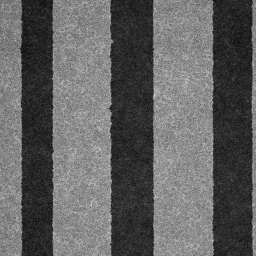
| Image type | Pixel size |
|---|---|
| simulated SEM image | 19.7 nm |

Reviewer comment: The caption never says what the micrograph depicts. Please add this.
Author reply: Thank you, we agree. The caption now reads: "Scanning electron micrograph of one or a few lines or trenches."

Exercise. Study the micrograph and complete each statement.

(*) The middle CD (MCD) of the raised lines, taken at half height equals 1150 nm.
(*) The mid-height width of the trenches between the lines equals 0.783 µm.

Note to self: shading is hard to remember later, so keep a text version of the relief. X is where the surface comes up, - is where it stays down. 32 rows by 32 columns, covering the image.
XXX----XXXXXXX-----XXXXXXXX-----
XXX----XXXXXXX-----XXXXXXXX-----
XXX----XXXXXXX-----XXXXXXX------
XXX----XXXXXXX-----XXXXXXXX-----
XXX----XXXXXXX-----XXXXXXXX-----
XXX----XXXXXXX-----XXXXXXXX-----
XXX----XXXXXXX-----XXXXXXXX-----
XXX----XXXXXXX-----XXXXXXXX-----
XXX----XXXXXXX-----XXXXXXXX-----
XXX----XXXXXXX-----XXXXXXX------
XXX----XXXXXXX-----XXXXXXXX-----
XXX----XXXXXXX-----XXXXXXXX-----
XXX----XXXXXXX-----XXXXXXXX-----
XXX----XXXXXXX-----XXXXXXXX-----
XXX----XXXXXXX-----XXXXXXXX-----
XXX----XXXXXXX-----XXXXXXXX-----
XXX----XXXXXXX-----XXXXXXXX-----
XXX----XXXXXXX-----XXXXXXXX-----
XXX----XXXXXXX-----XXXXXXXX-----
XXX----XXXXXXX-----XXXXXXXX-----
XXX----XXXXXXX-----XXXXXXXX-----
XXX----XXXXXXX-----XXXXXXXX-----
XXX----XXXXXXX-----XXXXXXXX-----
XXX----XXXXXXX-----XXXXXXXX-----
XXX----XXXXXXX-----XXXXXXXX-----
XXX----XXXXXXX-----XXXXXXXX-----
XXX----XXXXXXX-----XXXXXXXX-----
XXX----XXXXXXX-----XXXXXXXX-----
XXX----XXXXXXX-----XXXXXXXX-----
XXX----XXXXXXX-----XXXXXXXX-----
XXX----XXXXXXX-----XXXXXXXX-----
XXX----XXXXXXX-----XXXXXXXX-----